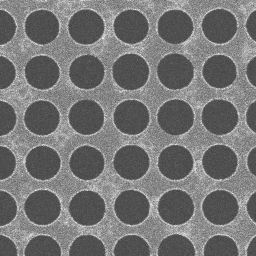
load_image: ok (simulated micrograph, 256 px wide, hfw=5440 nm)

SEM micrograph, a regular array of holes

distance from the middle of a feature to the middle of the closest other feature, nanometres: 940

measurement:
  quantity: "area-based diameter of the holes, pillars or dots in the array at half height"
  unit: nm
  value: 760